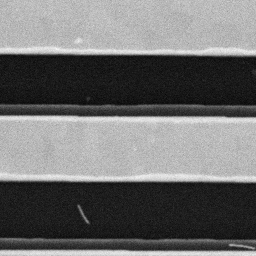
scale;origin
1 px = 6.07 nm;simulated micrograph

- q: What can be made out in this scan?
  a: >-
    lines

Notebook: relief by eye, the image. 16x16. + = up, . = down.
++++++++++++++++
++++++++++++++++
++++++++++++++++
................
................
................
................
++++++++++++++++
++++++++++++++++
++++++++++++++++
++++++++++++++++
................
................
................
................
................